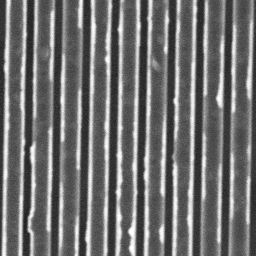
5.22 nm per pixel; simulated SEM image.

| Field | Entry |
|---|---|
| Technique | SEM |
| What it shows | parallel lines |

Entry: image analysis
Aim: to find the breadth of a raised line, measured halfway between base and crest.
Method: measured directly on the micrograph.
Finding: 104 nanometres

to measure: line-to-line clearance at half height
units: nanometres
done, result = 45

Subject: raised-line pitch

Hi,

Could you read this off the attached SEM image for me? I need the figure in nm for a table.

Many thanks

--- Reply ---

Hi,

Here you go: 148